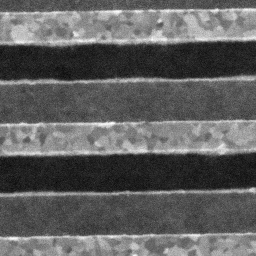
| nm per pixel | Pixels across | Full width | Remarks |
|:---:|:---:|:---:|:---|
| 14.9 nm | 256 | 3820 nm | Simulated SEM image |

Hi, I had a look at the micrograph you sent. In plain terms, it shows lines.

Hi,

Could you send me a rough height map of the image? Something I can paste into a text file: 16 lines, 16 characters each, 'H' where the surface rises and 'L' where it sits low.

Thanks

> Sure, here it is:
HHHHHHHHHHHHHHHH
HHHHHHHHHHHHHHHH
HHHHHHHHHHHLLLLL
LLLLLLLLLLLLLLLL
LLLLLLLLLLLLLLLL
HHHHHHHHHHHHHHHH
HHHHHHHHHHHHHHHH
HHHHHHHHHHHHHHHH
HHHHHHHHHHHHHHHH
HHHHHHHLLLLLLHLL
LLLLLLLLLLLLLLLL
LLLLLLLLLLLLLLLL
HHHHHHHHHHHHHHHH
HHHHHHHHHHHHHHHH
HHHHHHHHHHHHHHHH
HHHHHHHHHHHHHHHH